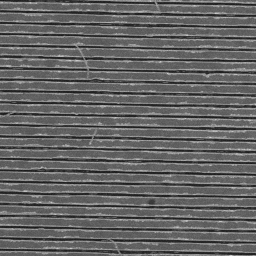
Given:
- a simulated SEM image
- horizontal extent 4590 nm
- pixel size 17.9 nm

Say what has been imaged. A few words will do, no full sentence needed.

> parallel lines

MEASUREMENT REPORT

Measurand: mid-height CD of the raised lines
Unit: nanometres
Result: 146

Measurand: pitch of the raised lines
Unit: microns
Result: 0.203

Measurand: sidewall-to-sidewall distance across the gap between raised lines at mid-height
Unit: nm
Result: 60.5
